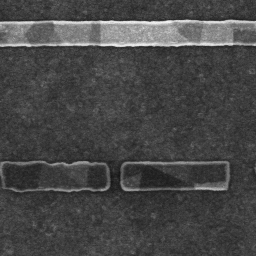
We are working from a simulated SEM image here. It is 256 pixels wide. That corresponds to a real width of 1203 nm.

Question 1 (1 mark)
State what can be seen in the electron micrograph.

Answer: one or a few lines or trenches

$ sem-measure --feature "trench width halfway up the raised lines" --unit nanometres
553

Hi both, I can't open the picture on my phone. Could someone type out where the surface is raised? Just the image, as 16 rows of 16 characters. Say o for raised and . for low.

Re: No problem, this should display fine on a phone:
................
oooooooooooooooo
oooooooooooooooo
................
................
................
................
................
................
................
ooooooo.oooooo..
ooooooo.oooooo..
................
................
................
................